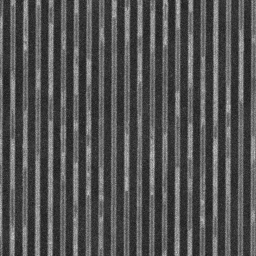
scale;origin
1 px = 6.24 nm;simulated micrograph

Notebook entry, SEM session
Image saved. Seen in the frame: parallel lines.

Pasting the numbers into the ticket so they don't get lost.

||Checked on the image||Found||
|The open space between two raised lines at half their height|0.0577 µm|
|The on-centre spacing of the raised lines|0.0791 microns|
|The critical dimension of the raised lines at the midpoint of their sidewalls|22.6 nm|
